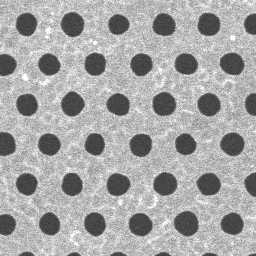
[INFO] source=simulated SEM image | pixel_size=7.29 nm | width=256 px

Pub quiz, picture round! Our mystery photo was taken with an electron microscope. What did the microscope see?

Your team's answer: a regular array of holes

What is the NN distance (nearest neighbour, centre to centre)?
330 nanometers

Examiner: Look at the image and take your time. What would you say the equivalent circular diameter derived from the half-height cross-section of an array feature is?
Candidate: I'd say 0.167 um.